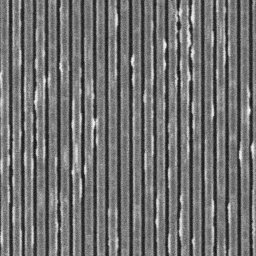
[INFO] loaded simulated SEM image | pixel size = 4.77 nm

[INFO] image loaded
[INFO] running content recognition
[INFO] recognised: parallel lines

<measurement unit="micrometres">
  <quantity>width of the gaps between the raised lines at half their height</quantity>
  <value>0.0179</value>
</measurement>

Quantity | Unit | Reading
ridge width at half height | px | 8.13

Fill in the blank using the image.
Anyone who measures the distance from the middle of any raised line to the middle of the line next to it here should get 57.3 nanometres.